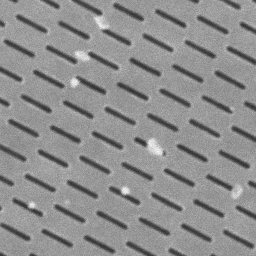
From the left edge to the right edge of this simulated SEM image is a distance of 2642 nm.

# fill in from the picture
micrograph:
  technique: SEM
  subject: a regular array of holes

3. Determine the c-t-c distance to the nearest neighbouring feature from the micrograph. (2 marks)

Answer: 281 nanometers